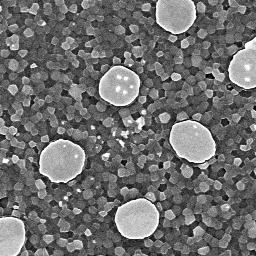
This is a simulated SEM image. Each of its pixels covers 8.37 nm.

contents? raised bodies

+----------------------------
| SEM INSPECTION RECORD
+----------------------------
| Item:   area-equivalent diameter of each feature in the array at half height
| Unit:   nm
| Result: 355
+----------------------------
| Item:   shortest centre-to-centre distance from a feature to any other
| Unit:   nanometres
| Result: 779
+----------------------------